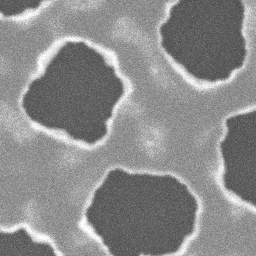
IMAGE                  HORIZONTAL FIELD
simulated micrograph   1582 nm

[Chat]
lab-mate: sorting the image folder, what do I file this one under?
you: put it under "holes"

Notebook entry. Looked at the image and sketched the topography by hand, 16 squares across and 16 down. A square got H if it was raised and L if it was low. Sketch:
LLHHHHHHHHHLLLLH
HHHHHHHHHHLLLLLH
HHHHHHHHHHLLLLLH
HHHLLLLHHHHLLLLH
HHHLLLLHHHHHLLLH
HHLLLLLLHHHHHHHH
HLLLLLLHHHHHHHHH
HHLLLLLHHHHHHHLL
HHHHLLLHHHHHHHLL
HHHHHHHHHHHHHHLL
HHHHHHHHHHHHHHLL
HHHHHHLLLLLHHHLL
HHHHHHLLLLLLHHHL
HHHHHLLLLLLLHHHH
LLHHHHLLLLLLHHHH
LLLHHHHLLLLHHHHH